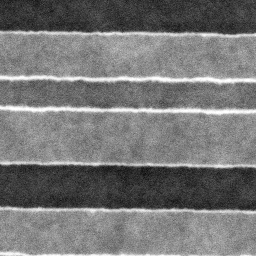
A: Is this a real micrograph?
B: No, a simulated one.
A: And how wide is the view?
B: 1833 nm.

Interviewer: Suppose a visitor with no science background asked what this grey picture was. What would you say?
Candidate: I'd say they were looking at lines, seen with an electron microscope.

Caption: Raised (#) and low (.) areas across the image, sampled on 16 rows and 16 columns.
................
................
################
################
################
################
################
################
################
################
................
................
................
################
################
################